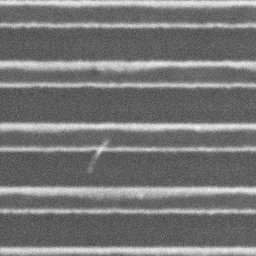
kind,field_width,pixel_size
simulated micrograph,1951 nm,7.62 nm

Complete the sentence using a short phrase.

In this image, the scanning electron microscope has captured lines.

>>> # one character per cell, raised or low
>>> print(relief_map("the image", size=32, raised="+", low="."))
++++++++++++++++++++++++++++++++
++++++++++++++++++++++++++++++++
++++++++++++++++++++++++++++++++
................................
................................
................................
................................
................................
++++++++++++++++++++++++++++++++
++++++++++++++++++++++++++++++++
++++++++++++++++++++++++++++++++
................................
................................
................................
................................
................................
++++++++++++++++++++++++++++++++
++++++++++++++++++++++++++++++++
++++++++++++++++++++++++++++++++
................................
................................
................................
................................
................................
++++++++++++++++++++++++++++++++
++++++++++++++++++++++++++++++++
+++++++++..+++.+++++++++++++++++
................................
................................
................................
................................
++++++++++++++++++++++++++++++++